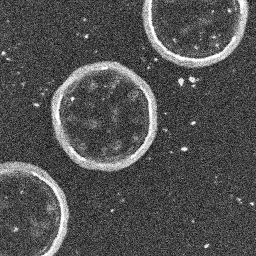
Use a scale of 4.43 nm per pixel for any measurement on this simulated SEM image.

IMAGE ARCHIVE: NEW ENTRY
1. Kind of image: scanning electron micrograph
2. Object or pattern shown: raised bodies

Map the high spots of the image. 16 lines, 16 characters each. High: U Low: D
DDDDDDDDDUUUUUUD
DDDDDDDDDUUUUUUD
DDDDDDDDDDUUUUUD
DDDDDDDDDDDUUUDD
DDDDDUUUDDDDDDDD
DDDDUUUUUDDDDDDD
DDDDUUUUUDDDDDDD
DDDDUUUUUUDDDDDD
DDDDUUUUUDDDDDDD
DDDDUUUUUDDDDDDD
DDDDDDDDDDDDDDDD
UUUDDDDDDDDDDDDD
UUUUDDDDDDDDDDDD
UUUUDDDDDDDDDDDD
UUUUDDDDDDDDDDDD
UUUDDDDDDDDDDDDD